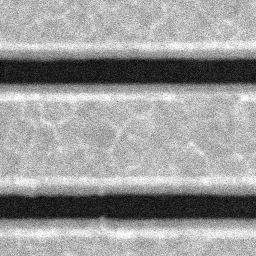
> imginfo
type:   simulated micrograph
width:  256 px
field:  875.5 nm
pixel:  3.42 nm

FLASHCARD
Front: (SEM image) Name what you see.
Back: one or a few lines or trenches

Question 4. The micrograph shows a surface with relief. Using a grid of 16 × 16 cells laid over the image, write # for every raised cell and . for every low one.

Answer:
################
################
################
................
................
................
################
################
################
################
################
################
................
................
################
################